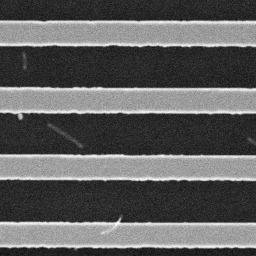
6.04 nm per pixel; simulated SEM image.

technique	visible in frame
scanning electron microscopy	lines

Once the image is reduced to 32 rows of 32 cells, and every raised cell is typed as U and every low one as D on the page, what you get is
DDDDDDDDDDDDDDDDDDDDDDDDDDDDDDDD
DDDDDDDDDDDDDDDDDDDDDDDDDDDDDDDD
DDDDDDDDDDDDDDDDDDDDDDDDDDDDDDDD
UUUUUUUUUUUUUUUUUUUUUUUUUUUUUUUU
UUUUUUUUUUUUUUUUUUUUUUUUUUUUUUUU
UUUUUUUUUUUUUUUUUUUUUUUUUUUUUUUU
DDDDDDDDDDDDDDDDDDDDDDDDDDDDDDDD
DDDDDDDDDDDDDDDDDDDDDDDDDDDDDDDD
DDDDDDDDDDDDDDDDDDDDDDDDDDDDDDDD
DDDDDDDDDDDDDDDDDDDDDDDDDDDDDDDD
DDDDDDDDDDDDDDDDDDDDDDDDDDDDDDDD
UUUUUUUUUUUUUUUUUUUUUUUUUUUUUUUU
UUUUUUUUUUUUUUUUUUUUUUUUUUUUUUUU
UUUUUUUUUUUUUUUUUUUUUUUUUUUUUUUU
DDDDDDDDDDDDDDDDDDDDDDDDDDDDDDDD
DDDDDDDDDDDDDDDDDDDDDDDDDDDDDDDD
DDDDDDDDDDDDDDDDDDDDDDDDDDDDDDDD
DDDDDDDDDDDDDDDDDDDDDDDDDDDDDDDD
DDDDDDDDDDDDDDDDDDDDDDDDDDDDDDDD
UUUUUUUUUUDUUUUUDUDUUUUDDUDDDDDD
UUUUUUUUUUUUUUUUUUUUUUUUUUUUUUUU
UUUUUUUUUUUUUUUUUUUUUUUUUUUUUUUU
DDDDDDDDDUUDDUDDUUUUUDUUUUUUUUUU
DDDDDDDDDDDDDDDDDDDDDDDDDDDDDDDD
DDDDDDDDDDDDDDDDDDDDDDDDDDDDDDDD
DDDDDDDDDDDDDDDDDDDDDDDDDDDDDDDD
DDDDDDDDDDDDDDDDDDDDDDDDDDDDDDDD
DDDDDDDDDDDDDDDDDDDDDDDDDDDDDDDD
UUUUUUUUUUUUUUUUUUUUUUUUUUUUUUUU
UUUUUUUUUUUUUUUUUUUUUUUUUUUUUUUU
UUUUUUUUUUUUUUUUUUUUUUUUUUUUUUUU
DDDDDDDDDDDDDDDDDDDDDDDDDDDDDDDD